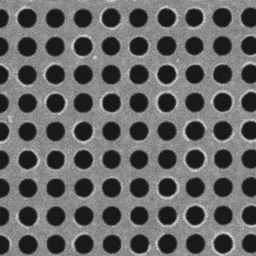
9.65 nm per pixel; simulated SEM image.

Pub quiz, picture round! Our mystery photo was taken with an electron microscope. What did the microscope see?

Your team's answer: a regular array of holes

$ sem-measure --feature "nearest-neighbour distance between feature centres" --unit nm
268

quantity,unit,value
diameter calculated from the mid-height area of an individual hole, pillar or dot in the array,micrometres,0.188